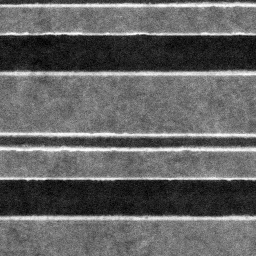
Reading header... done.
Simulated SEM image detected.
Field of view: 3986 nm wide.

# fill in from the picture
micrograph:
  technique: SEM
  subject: lines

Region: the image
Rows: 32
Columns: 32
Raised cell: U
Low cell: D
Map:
UUUUUUUUUUUUUUUUUUUUUUUUUUUUUUUU
UUUUUUUUUUUUUUUUUUUUUUUUUUUUUUUU
UUUUUUUUUUUUUUUUUUUUUUUUUUUUUUUU
UUUUUUUUUUUUUUUUUUUUUUUUUUUUUUUU
DDDDDDDDDDDDDDDDDDDDDDDDDDDDDDDD
DDDDDDDDDDDDDDDDDDDDDDDDDDDDDDDD
DDDDDDDDDDDDDDDDDDDDDDDDDDDDDDDD
DDDDDDDDDDDDDDDDDDDDDDDDDDDDDDDD
DDDDDDDDDDDDDDDDDDDDDDDDDDDDDDDD
UUUUUUUUUUUUUUUUUUUUUUUUUUUUUUUU
UUUUUUUUUUUUUUUUUUUUUUUUUUUUUUUU
UUUUUUUUUUUUUUUUUUUUUUUUUUUUUUUU
UUUUUUUUUUUUUUUUUUUUUUUUUUUUUUUU
UUUUUUUUUUUUUUUUUUUUUUUUUUUUUUUU
UUUUUUUUUUUUUUUUUUUUUUUUUUUUUUUU
UUUUUUUUUUUUUUUUUUUUUUUUUUUUUUUU
UUUUUUUUUUUUUUUUUUUUUUUUUUUUUUUU
UUUUUUUUUUUUUUUUUUUUUUUUUUUUUUUU
UUUUUUUUUUUUUUUUUUUUUUUUUUUUUUUU
UUUUUUUUUUUUUUUUUUUUUUUUUUUUUUUU
UUUUUUUUUUUUUUUUUUUUUUUUUUUUUUUU
UUUUUUUUUUUUUUUUUUUUUUUUUUUUUUUU
DDDDDDDDDDDDDDDDDDDDDDDDDDDDDDDD
DDDDDDDDDDDDDDDDDDDDDDDDDDDDDDDD
DDDDDDDDDDDDDDDDDDDDDDDDDDDDDDDD
DDDDDDDDDDDDDDDDDDDDDDDDDDDDDDDD
DDDDDDDDDDDDDDDDDDDDDDDDDDDDDDDD
UUUUUUUUUUUUUUUUUUUUUUUUUUUUUUUU
UUUUUUUUUUUUUUUUUUUUUUUUUUUUUUUU
UUUUUUUUUUUUUUUUUUUUUUUUUUUUUUUU
UUUUUUUUUUUUUUUUUUUUUUUUUUUUUUUU
UUUUUUUUUUUUUUUUUUUUUUUUUUUUUUUU